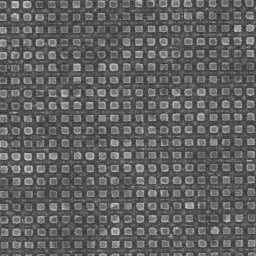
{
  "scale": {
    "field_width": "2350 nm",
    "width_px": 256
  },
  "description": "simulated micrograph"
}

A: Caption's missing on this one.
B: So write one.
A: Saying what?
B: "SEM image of a regular array of raised bodies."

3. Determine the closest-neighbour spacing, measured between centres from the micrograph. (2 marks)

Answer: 110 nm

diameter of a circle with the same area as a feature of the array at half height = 68.7 nm